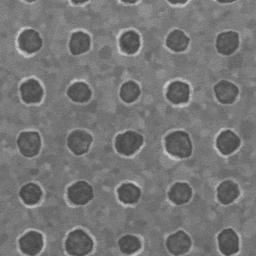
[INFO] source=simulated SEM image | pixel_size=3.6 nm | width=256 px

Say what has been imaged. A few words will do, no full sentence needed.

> a regular array of holes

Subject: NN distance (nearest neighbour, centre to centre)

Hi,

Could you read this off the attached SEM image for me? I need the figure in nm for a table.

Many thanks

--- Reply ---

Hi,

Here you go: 175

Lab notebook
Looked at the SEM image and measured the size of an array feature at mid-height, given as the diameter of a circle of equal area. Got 88.8 nm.